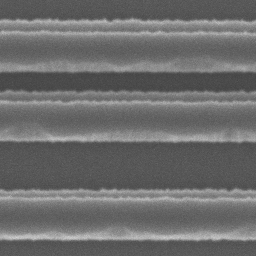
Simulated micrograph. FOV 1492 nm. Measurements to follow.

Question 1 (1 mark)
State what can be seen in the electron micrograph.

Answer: lines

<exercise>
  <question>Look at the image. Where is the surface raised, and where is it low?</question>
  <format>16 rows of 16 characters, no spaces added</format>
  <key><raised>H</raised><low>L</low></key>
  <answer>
LLLLLLLLLLLLLLLL
HHHHHHHHHHHHHHHH
HHHHHHHHHHHHHHHH
HHHHHHHHHHHHHHHH
LLLLLLLLLLLLLLLL
LLLLLLLLLLLLLLLL
HHHHHHHHHHHHHHHH
HHHHHHHHHHHHHHHH
HHHHHHHHHHHHHHHH
LLLLLLLLLLLLLLLL
LLLLLLLLLLLLLLLL
LLLLLLLLLLLLLLLL
HHHHHHHHHHHHHHHH
HHHHHHHHHHHHHHHH
HHHHHHHHHHHHHHHH
LLLLLLLLLLLLLLLL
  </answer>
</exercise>